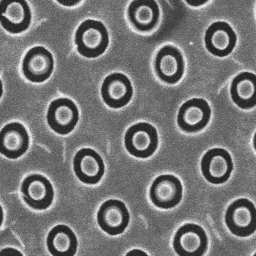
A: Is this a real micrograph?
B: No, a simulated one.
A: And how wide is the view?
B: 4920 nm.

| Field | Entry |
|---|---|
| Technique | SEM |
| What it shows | a regular array of ring-shaped grooves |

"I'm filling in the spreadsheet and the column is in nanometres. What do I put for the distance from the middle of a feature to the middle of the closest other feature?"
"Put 1080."